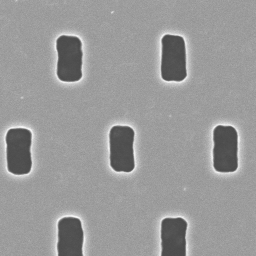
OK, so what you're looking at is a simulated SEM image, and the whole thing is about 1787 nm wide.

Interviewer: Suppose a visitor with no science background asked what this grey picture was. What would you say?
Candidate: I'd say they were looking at holes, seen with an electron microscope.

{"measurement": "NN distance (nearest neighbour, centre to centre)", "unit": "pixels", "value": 103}